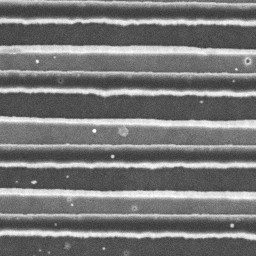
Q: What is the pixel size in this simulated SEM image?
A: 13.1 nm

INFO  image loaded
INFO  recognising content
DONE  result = lines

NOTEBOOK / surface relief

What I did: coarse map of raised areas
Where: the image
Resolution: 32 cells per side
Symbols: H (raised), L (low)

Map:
HHHHHHHHHHHHHHHHHHHHHHHHHHHHHHHH
HHHHHHHHHHHHHHHHHHHHHHHHHHHHHHHH
LLHHHLLLHHHLLHHHHHHHHHHHHHHHHHHH
LLLLLLLLLLLLLLLLLLLLLLLLLLLLLLLL
LLLLLLLLLLLLLLLLLLLLLLLLLLLLLLLL
LLLLLLLLLLLLLLLLLLLLLLLLLLLLLLLL
HHHHHHHHHHHHHHHHHHHHHHHHHHHHHLLL
HHHHHHHHHHHHHHHHHHHHHHHHHHHHHHHH
HHHHHHHHHHHHHHHHHHHHHHHHHHHHHHHH
HHHHHHHHHHHHHHHHHHHHHHHHHHHHHHHH
HHHHHHHHHHHHHHHHHHHHHHHHHHHHHHHH
LLLLLLLLLLLLLLLLLLLLLLHHHHHHHHHH
LLLLLLLLLLLLLLLLLLLLLLLLLLLLLLLL
LLLLLLLLLLLLLLLLLLLLLLLLLLLLLLLL
LLLLLLLLLLLLLLLLLLLLLLLLLLLLLLLL
HHHHHHHHHHHHHHHHHHHHHHHHHLLLLLLL
HHHHHHHHHHHHHHHHHHHHHHHHHHHHHHHH
HHHHHHHHHHHHHHHHHHHHHHHHHHHHHHHH
HHHHHHHHHHHHHHHHHHHHHHHHHHHHHHHH
HHHHHHHHHHHHHHHHHHHHHHHHHHHHHHHH
LLLHHLLHHLLHLLLHHHHHLHLHHLLHHLLH
LLLLLLLLLLLLLLLLLLLLLLLLLLLLLLLL
LLLLLLLLLLLLLLLLLLLLLLLLLLLLLLLL
LLLLLLLLLLLLLLLLLLLLLLLLLLLLLLLL
HHHHHHHHHHHHHHHHHHHHHHHHHHHHHLLL
HHHHHHHHHHHHHHHHHHHHHHHHHHHHHHHH
HHHHHHHHHHHHHHHHHHHHHHHHHHHHHHHH
HHHHHHHHHHHHHHHHHHHHHHHHHHHHHHHH
HHHHHHHHHHHHHHHHHHHHHHHHHHHHHHHH
LLLLLLLLLLLLLLLLLLLLLLLLLLLLLLLL
LLLLLLLLLLLLLLLLLLLLLLLLLLLLLLLL
LLLLLLLLLLLLLLLLLLLLLLLLLLLLLLLL